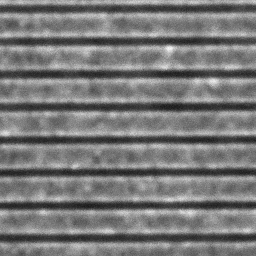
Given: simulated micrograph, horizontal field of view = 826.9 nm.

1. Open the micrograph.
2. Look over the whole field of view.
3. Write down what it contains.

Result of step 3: parallel lines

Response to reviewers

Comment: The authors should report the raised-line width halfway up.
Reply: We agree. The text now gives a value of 0.0728 um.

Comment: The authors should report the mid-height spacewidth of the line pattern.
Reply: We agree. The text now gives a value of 34.8 nm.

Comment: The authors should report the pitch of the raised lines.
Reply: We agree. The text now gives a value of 0.106 microns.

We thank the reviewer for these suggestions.